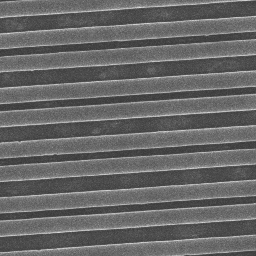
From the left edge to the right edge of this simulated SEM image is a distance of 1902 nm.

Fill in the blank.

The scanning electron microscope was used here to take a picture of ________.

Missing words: parallel lines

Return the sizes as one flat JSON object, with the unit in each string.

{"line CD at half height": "115 nm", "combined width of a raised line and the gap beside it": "200 nanometres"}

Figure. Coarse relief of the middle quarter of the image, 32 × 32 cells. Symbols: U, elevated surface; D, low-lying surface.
UUUUUDDDDDDDDDDDDDDDDDDDDDDDDDDD
DDDDDDDDDDDDDDDDDDDDDDDDDDDDDDDD
DDDDDDDDDDDDDDDDDDDDDDDDDDDDDDDD
DDDDDDDDDDDDDDDDDDDDDDDUUUUUUUUU
DDDDDDDDDUUUUUUUUUUUUUUUUUUUUUUU
UUUUUUUUUUUUUUUUUUUUUUUUUUUUUUUU
UUUUUUUUUUUUUUUUUUUUUUUUUUUUUUUU
UUUUUUUUUUUUUUUUUUUDDDDDDDDDDDDD
UUUUDDDDDDDDDDDDDDDDDDDDDDDDDDDD
DDDDDDDDDDDDDDDDDDDDDUUUUUUUUUUU
DDDDDDUUUUUUUUUUUUUUUUUUUUUUUUUU
UUUUUUUUUUUUUUUUUUUUUUUUUUUUUUUU
UUUUUUUUUUUUUUUUUUUUUUUUUUUUUUDD
UUUUUUUUUUUUUUUUDDDDDDDDDDDDDDDD
UDDDDDDDDDDDDDDDDDDDDDDDDDDDDDDD
DDDDDDDDDDDDDDDDDDDDDDDDDDDDDDDD
DDDDDDDDDDDDDDDDDDDDDDDDDDDDDDDD
DDDDDDDDDDDDDDDDDUUUUUUUUUUUUUUU
DDUUUUUUUUUUUUUUUUUUUUUUUUUUUUUU
UUUUUUUUUUUUUUUUUUUUUUUUUUUUUUUU
UUUUUUUUUUUUUUUUUUUUUUUUUUUDDDDD
UUUUUUUUUUUUDUDDDDDDDDDDDDDDDDDD
DDDDDDDDDDDDDDDDDDDDDDDDDDDDDUDU
DDDDDDDDDDDDDDUUUUUUUUUUUUUUUUUU
UUUUUUUUUUUUUUUUUUUUUUUUUUUUUUUU
UUUUUUUUUUUUUUUUUUUUUUUUUUUUUUUU
UUUUUUUUUUUUUUUUUUUUUUUUUUDDDDDD
UUUUUUUUUUUDDDDDDDDDDDDDDDDDDDDD
DDDDDDDDDDDDDDDDDDDDDDDDDDDDDDDD
DDDDDDDDDDDDDDDDDDDDDDDDDDDDDDDD
DDDDDDDDDDDDDDDDDDDDDDDDDDDDUUUU
DDDDDDDDDDDDDDUUUUUUUUUUUUUUUUUU